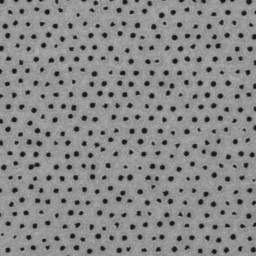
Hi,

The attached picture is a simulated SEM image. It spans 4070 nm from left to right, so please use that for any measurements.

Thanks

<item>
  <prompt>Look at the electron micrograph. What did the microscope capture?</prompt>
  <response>a regular array of holes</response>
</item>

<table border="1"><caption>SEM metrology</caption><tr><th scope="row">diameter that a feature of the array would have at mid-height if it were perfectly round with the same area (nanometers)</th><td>82.2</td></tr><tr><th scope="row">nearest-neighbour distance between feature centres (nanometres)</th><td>182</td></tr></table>